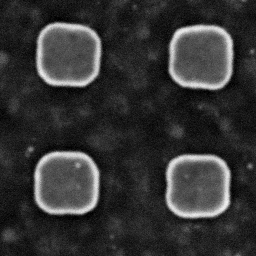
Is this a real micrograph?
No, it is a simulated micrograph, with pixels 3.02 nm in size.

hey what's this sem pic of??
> raised bodies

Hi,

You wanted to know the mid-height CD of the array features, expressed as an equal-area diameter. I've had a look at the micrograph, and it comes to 64 px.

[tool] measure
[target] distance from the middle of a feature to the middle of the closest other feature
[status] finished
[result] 388 nm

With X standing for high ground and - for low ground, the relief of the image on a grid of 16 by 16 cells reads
----------------
----------------
--XXXX-----XXX--
--XXXX-----XXX--
---XXX-----XXX--
----------------
----------------
----------------
----------------
----------------
--XXXX-----XXX--
--XXXX-----XXX--
--XXXX-----XXX--
----------------
----------------
----------------